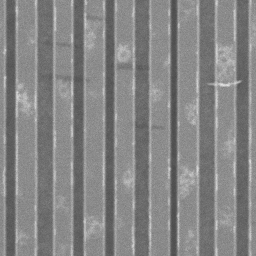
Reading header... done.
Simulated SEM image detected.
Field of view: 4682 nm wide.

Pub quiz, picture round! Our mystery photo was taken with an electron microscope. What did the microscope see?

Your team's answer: parallel lines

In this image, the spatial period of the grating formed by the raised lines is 608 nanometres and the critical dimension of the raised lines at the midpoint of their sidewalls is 377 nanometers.